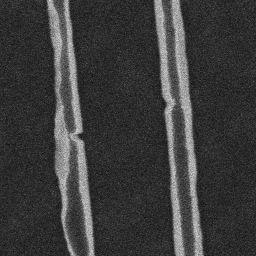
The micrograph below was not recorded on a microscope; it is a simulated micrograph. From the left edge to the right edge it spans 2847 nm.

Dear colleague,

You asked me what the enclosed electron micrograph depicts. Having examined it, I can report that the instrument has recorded one or a few lines or trenches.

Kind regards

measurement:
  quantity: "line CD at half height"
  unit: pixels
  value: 19.2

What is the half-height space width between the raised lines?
90.3 pixels